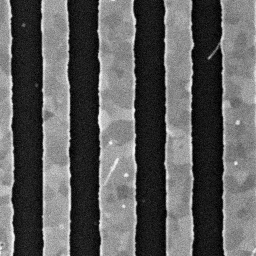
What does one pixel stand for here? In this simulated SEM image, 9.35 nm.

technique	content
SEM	lines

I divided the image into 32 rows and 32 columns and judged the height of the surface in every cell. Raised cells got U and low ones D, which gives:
UDDDDUUUDDDDUUUUUDDDDUUUDDDDUUUU
UDDDDUUUDDDDUUUUUDDDDUUUDDDDUUUU
UDDDDUUUUDDDUUUUUDDDDUUUDDDDUUUU
UDDDDUUUUDDDUUUUUDDDDUUUDDDDUUUU
UDDDDUUUUDDDUUUUUDDDDUUUDDDDUUUU
UDDDDUUUUDDDUUUUUDDDDUUUDDDDUUUU
UDDDDUUUUDDDUUUUUDDDDUUUDDDDUUUU
UDDDDUUUUDDDUUUUUDDDDUUUDDDDUUUU
UDDDDUUUDDDDDUUUUDDDDUUUDDDDUUUU
UDDDDUUUDDDDUUUUUDDDDUUUDDDDUUUU
UUDDDUUUUDDDUUUUUDDDDUUUDDDDUUUU
UDDDDUUUUDDDUUUUUDDDDUUUDDDDUUUU
UDDDDUUUUDDDUUUUUDDDDUUUDDDDUUUU
UUDDDUUUUDDDUUUUUDDDDUUUDDDDUUUU
UUDDDUUUUDDDUUUUUDDDDUUUDDDDUUUU
UDDDDUUUUDDDUUUUUDDDDUUUDDDDUUUU
UUDDDUUUUDDDUUUUUDDDDUUUDDDDUUUU
UUDDDUUUUDDDUUUUUDDDDUUUDDDDUUUU
UUDDDUUUUDDDDUUUUDDDDUUUDDDDUUUU
UUDDDUUUUDDDUUUUUDDDDUUUDDDDUUUU
UUDDDUUUUDDDUUUUUDDDDUUUDDDDUUUU
UUDDDUUUUDDDUUUUUDDDDUUUDDDDUUUU
UUDDDUUUUDDDUUUUUDDDDUUUDDDDUUUU
UUDDDUUUUDDDUUUUUDDDDUUUDDDDUUUU
UDDDDUUUUDDDUUUUUDDDDUUUDDDDUUUU
UUDDDUUUUDDDUUUUUDDDDUUUDDDDUUUU
UUDDDUUUUDDDUUUUUDDDDUUUDDDDUUUU
UUDDDUUUUDDDUUUUUDDDDUUUDDDDUUUU
UUDDDUUUUDDDUUUUUDDDDUUUDDDDUUUU
UUDDDUUUUDDDDUUUUDDDDUUUDDDDUUUU
UUDDDDUUUDDDDUUUUDDDDUUUDDDDUUUU
UUDDDUUUUDDDDUUUUDDDDUUUDDDDUUUU